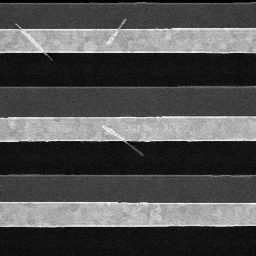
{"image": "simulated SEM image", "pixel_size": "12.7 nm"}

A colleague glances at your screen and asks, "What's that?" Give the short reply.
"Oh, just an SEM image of lines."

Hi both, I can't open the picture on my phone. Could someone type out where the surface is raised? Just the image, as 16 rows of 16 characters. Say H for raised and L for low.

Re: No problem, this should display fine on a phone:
HHHHHHHHHHHHHHHH
HHHHHHHHHHHHHHHH
HHHHHHHHHHHHHHHH
LLLLLLLLLLLLLLLL
LLLLLLLLLLLLLLLL
HHHHHHHHHHHHHHHH
HHHHHHHHHHHHHHHH
HHHHHHHHHHHHHHHH
HHHHHHHHHHHHHHHH
LLLLLLLLLLLLLLLL
LLLLLLLLLLLLLLLL
HHHHHHHHHHHHHHHH
HHHHHHHHHHHHHHHH
HHHHHHHHHHHHHHHH
LLLLLLLLLLLLLLLL
LLLLLLLLLLLLLLLL